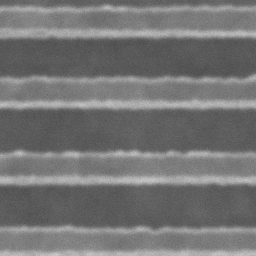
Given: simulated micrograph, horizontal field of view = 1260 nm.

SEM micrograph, lines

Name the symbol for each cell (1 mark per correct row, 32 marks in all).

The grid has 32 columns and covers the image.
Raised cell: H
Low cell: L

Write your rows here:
LLLLLLLLLLLLLLLLLLLLLLLLLLLLLLLL
HHHHHHHHHHHHHHHHHHHHHHHHHHHHHHHH
HHHHHHHHHHHHHHHHHHHHHHHHHHHHHHHH
HHHHHHHHHHHHHHHHHHHHHHHHHHHHHHHH
HHHHHHLHHHHHHHHHLLHHHLHLHHHHHLLL
LLLLLLLLLLLLLLLLLLLLLLLLLLLLLLLL
LLLLLLLLLLLLLLLLLLLLLLLLLLLLLLLL
LLLLLLLLLLLLLLLLLLLLLLLLLLLLLLLL
LLLLLLLLLLLLLLLLLLLLLLLLLLLLLLLL
LLLLLLLLLLLLLLLLLLLLLLLLLLLLLLLL
HHHHHHHHHHHHHHHHHHHHHHHHHHHHHHHH
HHHHHHHHHHHHHHHHHHHHHHHHHHHHHHHH
HHHHHHHHHHHHHHHHHHHHHHHHHHHHHHHH
LLLLLLLLLLLLLLLLLLLLLLLLLLLLLLLL
LLLLLLLLLLLLLLLLLLLLLLLLLLLLLLLL
LLLLLLLLLLLLLLLLLLLLLLLLLLLLLLLL
LLLLLLLLLLLLLLLLLLLLLLLLLLLLLLLL
LLLLLLLLLLLLLLLLLLLLLLLLLLLLLLLL
LLLLLLLLLLLLLLLLLLLLLLLLLLLLLLLL
HHHHHHHHHHHHHHHHHHHHHHHHHHHHHHHH
HHHHHHHHHHHHHHHHHHHHHHHHHHHHHHHH
HHHHHHHHHHHHHHHHHHHHHHHHHHHHHHHH
HHHHHHHHHHHHHHHHHHHHHHHHHHHHHHHH
LLLLLLLLLLLLLLLLLLLLLLLLLLLLLLLL
LLLLLLLLLLLLLLLLLLLLLLLLLLLLLLLL
LLLLLLLLLLLLLLLLLLLLLLLLLLLLLLLL
LLLLLLLLLLLLLLLLLLLLLLLLLLLLLLLL
LLLLLLLLLLLLLLLLLLLLLLLLLLLLLLLL
LLLLLLLLHLLLLLLLLHLLLLLLLLLLLLLL
HHHHHHHHHHHHHHHHHHHHHHHHHHHHHHHH
HHHHHHHHHHHHHHHHHHHHHHHHHHHHHHHH
HHHHHHHHHHHHHHHHHHHHHHHHHHHHHHHH